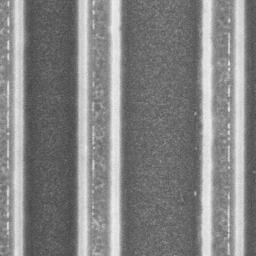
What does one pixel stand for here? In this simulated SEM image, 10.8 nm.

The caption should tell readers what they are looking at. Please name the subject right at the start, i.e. one or a few lines or trenches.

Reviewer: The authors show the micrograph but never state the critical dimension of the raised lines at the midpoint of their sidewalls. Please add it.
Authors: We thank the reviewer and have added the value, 0.351 microns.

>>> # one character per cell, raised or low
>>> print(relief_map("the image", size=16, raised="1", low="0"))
1000011000000110
1000011000000110
1000011000000110
1000011000000110
1000011000000110
1000011000000110
1000011000000110
1000011000000110
1000011000000110
1000011000000110
1000011000000110
1000011000000110
1000011000000110
1000011000000110
1000011000000110
1000011000000110